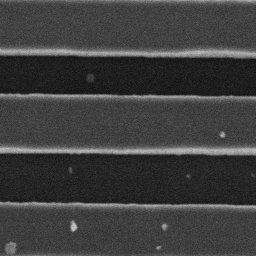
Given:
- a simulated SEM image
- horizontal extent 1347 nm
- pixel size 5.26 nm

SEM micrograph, lines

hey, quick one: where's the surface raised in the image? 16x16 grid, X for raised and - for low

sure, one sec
XXXXXXXXXXXXXXXX
XXXXXXXXXXXXXXXX
XXXXXXXXXXXXXXXX
----------------
----------------
----------------
XXXXXXXXXXXXXXXX
XXXXXXXXXXXXXXXX
XXXXXXXXXXXXXXXX
-------XXXXXXXXX
----------------
----------------
----------------
XXXXXXXXXXXXXXXX
XXXXXXXXXXXXXXXX
XXXXXXXXXXXXXXXX